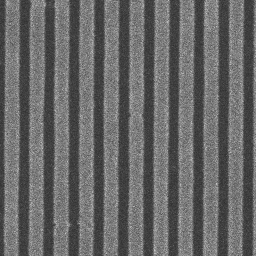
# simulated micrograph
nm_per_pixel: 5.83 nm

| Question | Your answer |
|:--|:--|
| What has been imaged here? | parallel lines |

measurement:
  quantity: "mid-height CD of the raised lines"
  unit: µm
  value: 0.0787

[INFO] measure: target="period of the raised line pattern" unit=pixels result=24.9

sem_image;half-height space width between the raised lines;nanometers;64.1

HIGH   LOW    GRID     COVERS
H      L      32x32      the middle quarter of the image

HLLLHHHLLLHHHLLLLHHHLLLHHHLLLHHH
HLLLHHHLLLHHHLLLLHHHLLLHHHLLLHHH
HLLLHHHLLLHHHLLLLHHHLLLHHHLLLHHH
HLLLHHHLLLHHHLLLLHHHLLLHHHLLLHHH
HLLLHHHLLLHHHLLLLHHHLLLHHHLLLHHH
HLLLHHHLLLHHHLLLLHHHLLLHHHLLLHHH
HLLLHHHLLLHHHLLLLHHHLLLHHHLLLHHH
HLLLHHHLLLHHHLLLLHHHLLLHHHLLLHHH
HLLLHHHLLLHHHLLLLHHHLLLHHHLLLHHH
HLLLHHHLLLHHHLLLLHHHLLLHHHLLLHHH
HLLLHHHLLLHHHLLLLHHHLLLHHHLLLHHH
HLLLHHHLLLHHHLLLLHHHLLLHHHLLLHHH
HLLLHHHLLLHHHLLLLHHHLLLHHHLLLHHH
HLLLHHHLLLHHHLLLLHHHLLLHHHLLLHHH
HLLLHHHLLLHHHLLLHHHHLLLHHHLLLHHH
HLLLHHHLLLHHHLLLHHHHLLLHHHLLLHHH
HLLLHHHLLLHHHLLLHHHHLLLHHHLLLHHH
HLLLHHHLLLHHHLLLHHHHLLLHHHLLLHHH
HLLLHHHLLLHHHLLLHHHHLLLHHHLLLHHH
HLLLHHHLLLHHHLLLLHHHLLLHHHLLLHHH
HLLLHHHLLLHHHLLLLHHHLLLHHHLLLHHH
HLLLHHHLLLHHHLLLLHHHLLLHHHLLLHHH
HLLLHHHLLLHHHLLLLHHHLLLHHHLLLHHH
HLLLHHHLLLHHHLLLLHHHLLLHHHLLLHHH
HLLLHHHLLLHHHLLLLHHHLLLHHHLLLHHH
HLLLHHHLLLHHHLLLLHHHLLLHHHLLLHHH
HLLLHHHLLLHHHLLLLHHHLLLHHHLLLHHH
HLLLHHHLLLHHHLLLLHHHLLLHHHLLLHHH
HLLLHHHLLLHHHLLLLHHHLLLHHHLLLHHH
HLLLHHHLLLHHHLLLLHHLLLLHHHLLLHHH
HLLLHHHLLLHHHLLLLHHHLLLHHHLLLHHH
HLLLHHHLLLHHHLLLLHHHLLLHHHLLLHHH